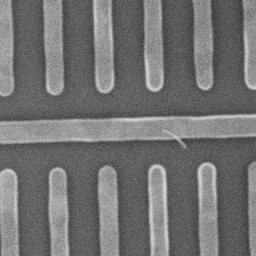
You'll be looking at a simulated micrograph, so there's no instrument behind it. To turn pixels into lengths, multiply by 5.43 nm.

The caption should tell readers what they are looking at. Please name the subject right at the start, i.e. groups of lines, slits or small figures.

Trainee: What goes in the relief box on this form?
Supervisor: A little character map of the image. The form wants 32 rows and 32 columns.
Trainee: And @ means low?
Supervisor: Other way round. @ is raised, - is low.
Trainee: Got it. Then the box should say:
@-----@@----@@----@@----@@----@@
@-----@@----@@----@@----@@-----@
@-----@@----@@----@@----@@-----@
@-----@@----@@----@@----@@-----@
@-----@@----@@----@@----@@-----@
@-----@@----@@----@@----@@-----@
@-----@@----@@----@@----@@-----@
@-----@@----@@----@@----@@-----@
@-----@@----@@----@@-----@-----@
@@----@@----@@----@@-----@-----@
@@----@@----@@-----@-----@-----@
@-----@-------------------------
--------------------------------
--------------------------------
--------------------------------
@@@@@@@@@@@@@@@@@@@@@@@@@@@@@@@@
@@@@@@@@@@@@@@@@@@@@@@@@@@@@@@@@
@@@@@@@@@-@@@@@-----------------
--------------------------------
--------------------------------
--------------------------------
@@-----@-----@-----@-----@@----@
@@----@@----@@@----@@----@@----@
@@----@@----@@@----@@----@@----@
@@----@@----@@@----@@----@@----@
@@----@@----@@@----@@----@@----@
@@----@@-----@@----@@----@@----@
@@----@@-----@@----@@----@@----@
@@----@@-----@@----@@----@@----@
@@----@@-----@@----@@----@@----@
@@----@@-----@@----@@----@@----@
@@-----@@----@@----@@----@@----@